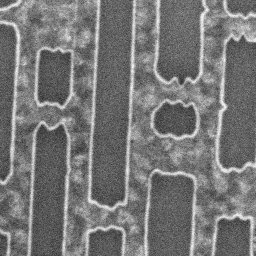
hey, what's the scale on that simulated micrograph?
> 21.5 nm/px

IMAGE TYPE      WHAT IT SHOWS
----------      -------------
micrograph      one or a few lines or trenches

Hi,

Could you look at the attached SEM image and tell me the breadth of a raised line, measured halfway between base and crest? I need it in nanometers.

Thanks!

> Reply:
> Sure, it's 481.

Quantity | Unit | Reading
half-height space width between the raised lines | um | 0.797